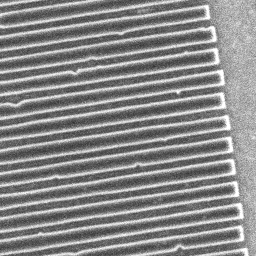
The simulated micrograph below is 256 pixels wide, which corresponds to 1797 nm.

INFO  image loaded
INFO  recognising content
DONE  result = parallel lines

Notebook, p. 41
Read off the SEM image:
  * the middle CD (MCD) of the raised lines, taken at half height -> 0.0945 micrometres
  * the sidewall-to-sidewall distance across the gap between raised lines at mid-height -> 60.8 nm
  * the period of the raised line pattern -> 0.157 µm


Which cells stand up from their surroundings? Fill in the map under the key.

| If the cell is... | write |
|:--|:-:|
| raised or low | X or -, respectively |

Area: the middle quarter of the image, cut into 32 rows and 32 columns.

------------XXXXXXXXXXXXXXXXXXXX
----XXXXXXXXXXXXXXXXXXXXXXX-----
XXXXXXXXXXXXXXXXXXXX------------
XXXXXXXXXXXXXX---------------XXX
XXXXXXX---------------XXXXXXXXXX
----------------XXXXXXXXXXXXXXXX
---------XXXXXXXXXXXXXXXXXXXX---
---XXXXXXXXXXXXXXXXXXX----------
XXXXXXXXXXXXXXXX---------------X
XXXXXXXXXXX---------------XXXXXX
XXXX--------------X-XXXXXXXXXXXX
-------------XXXXXXXXXXXXXXXXXXX
-------XXXXXXXXXXXXXXXXXXXXXX---
XXXXXXXXXXXXXXXXXXXXX-----------
XXXXXXXXXXXXXXX-----------------
XXXXXXXX-----------------XXXXXXX
XX---------------XXXXXXXXXXXXXXX
-----------XXXXXXXXXXXXXXXXXXXXX
----XXXXXXXXXXXXXXXXXXXXXX------
XXXXXXXXXXXXXXXXXXXX------------
XXXXXXXXXXXXXX---------------XXX
XXXXXXX--------------XXXXXXXXXXX
X--------------XXXXXXXXXXXXXXXXX
--------XXXXXXXXXXXXXXXXXXXXXXX-
-XXXXXXXXXXXXXXXXXXXXXXX--------
XXXXXXXXXXXXXXXXXX--------------
XXXXXXXXXXX---------------XXXXXX
XXXXX---------------XXXXXXXXXXXX
-------------XXXXXXXXXXXXXXXXXXX
--------XXXXXXXXXXXXXXXXXXXX----
XXXXXXXXXXXXXXXXXXXXXX----------
XXXXXXXXXXXXXXXXX---------------